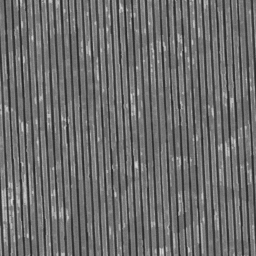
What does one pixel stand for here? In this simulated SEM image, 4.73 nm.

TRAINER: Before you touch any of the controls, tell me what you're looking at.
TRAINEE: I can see parallel lines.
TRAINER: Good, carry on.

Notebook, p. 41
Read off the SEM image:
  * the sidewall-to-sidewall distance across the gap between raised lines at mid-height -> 12.4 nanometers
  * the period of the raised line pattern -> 33.3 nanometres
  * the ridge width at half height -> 21.3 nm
